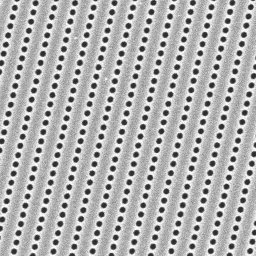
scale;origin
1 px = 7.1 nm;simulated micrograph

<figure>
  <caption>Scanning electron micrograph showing a regular array of holes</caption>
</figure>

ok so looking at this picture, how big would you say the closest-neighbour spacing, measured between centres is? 0.0664 microns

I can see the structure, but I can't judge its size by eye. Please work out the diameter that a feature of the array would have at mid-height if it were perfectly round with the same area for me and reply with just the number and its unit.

41.6 nm